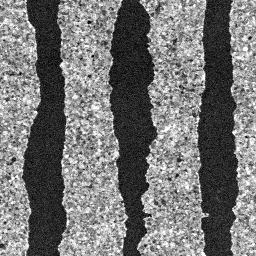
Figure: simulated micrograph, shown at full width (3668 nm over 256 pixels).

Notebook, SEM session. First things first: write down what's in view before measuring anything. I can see one or a few lines or trenches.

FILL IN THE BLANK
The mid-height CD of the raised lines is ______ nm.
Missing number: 745